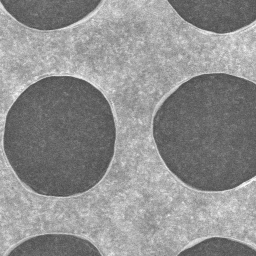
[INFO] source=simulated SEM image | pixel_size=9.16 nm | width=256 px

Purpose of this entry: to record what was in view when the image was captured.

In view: holes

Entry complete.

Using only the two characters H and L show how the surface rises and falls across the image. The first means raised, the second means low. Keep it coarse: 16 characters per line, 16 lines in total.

LLLLLLHHHHHLLLLL
HLLLLHHHHHHHLLLL
HHHHHHHHHHHHHHHH
HHHHHHHHHHHHHHHH
HHHHHHHHHHHHHHHH
HHLLLLHHHHHLLLLL
HLLLLLLHHHLLLLLL
LLLLLLLHHHLLLLLL
LLLLLLLHHHLLLLLL
LLLLLLLHHHLLLLLL
HLLLLLLHHHHLLLLL
HLLLLLHHHHHHLLLH
HHHHHHHHHHHHHHHH
HHHHHHHHHHHHHHHH
HHHHHHHHHHHHHHHH
HLLLLLHHHHHHLLLL